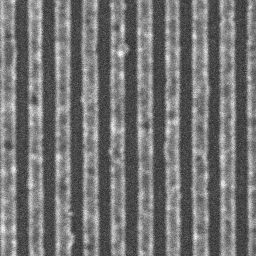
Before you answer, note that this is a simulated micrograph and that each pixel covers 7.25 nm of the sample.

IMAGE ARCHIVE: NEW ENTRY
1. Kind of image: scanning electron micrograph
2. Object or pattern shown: parallel lines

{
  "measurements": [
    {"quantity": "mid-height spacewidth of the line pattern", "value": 113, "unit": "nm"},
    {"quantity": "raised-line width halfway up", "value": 85.2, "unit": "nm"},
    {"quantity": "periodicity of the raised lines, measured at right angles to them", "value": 199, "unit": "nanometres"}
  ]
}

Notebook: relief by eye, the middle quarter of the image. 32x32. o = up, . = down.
o....ooo....oo.....ooo....oo....
o....ooo....oo.....ooo....oo....
o....ooo....oo.....ooo....oo....
o....ooo....oo.....ooo....oo....
o....ooo....oo.....ooo....oo....
o....ooo....ooo....ooo....oo....
o....ooo....ooo....ooo....oo....
o....ooo....ooo....ooo....oo....
o....ooo....ooo....ooo....oo....
o....ooo....ooo....ooo....oo....
o....ooo....ooo....ooo....oo....
o....ooo....ooo....ooo....oo....
o....ooo....ooo....ooo....oo....
o....ooo....ooo....ooo....oo....
o....ooo....ooo....ooo....oo....
o....ooo....ooo....ooo....oo....
o....ooo....ooo....ooo....oo....
o....ooo....ooo....ooo....oo....
o....ooo....ooo....ooo....oo....
o....ooo....ooo....ooo....oo....
o....ooo....ooo....ooo....oo....
o....ooo....ooo....ooo....oo....
o....ooo....ooo....ooo....oo....
o....ooo....ooo....ooo....oo....
o....ooo....ooo....ooo....oo....
o....ooo....ooo....ooo....oo....
o....ooo....ooo....ooo....oo....
o....ooo....ooo....ooo....oo....
o....ooo....ooo....ooo....oo....
o....ooo....ooo....ooo....oo....
o....ooo....ooo....ooo....oo....
o....ooo....ooo....ooo....ooo...